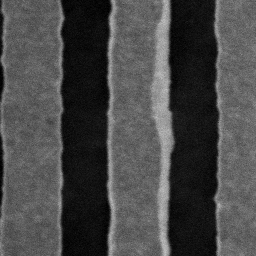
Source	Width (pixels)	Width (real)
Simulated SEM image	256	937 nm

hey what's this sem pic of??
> lines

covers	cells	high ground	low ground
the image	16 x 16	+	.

++++...+++....++
++++...+++...+++
++++...+++....++
++++...+++....++
++++...+++....++
++++...+++....++
++++...+++....++
++++...+++....++
++++...+++....++
++++...+++....++
++++...+++....++
++++...+++....++
++++...+++...+++
++++...+++....++
++++...+++....++
++++...+++....++